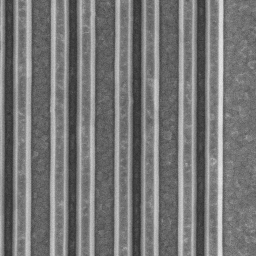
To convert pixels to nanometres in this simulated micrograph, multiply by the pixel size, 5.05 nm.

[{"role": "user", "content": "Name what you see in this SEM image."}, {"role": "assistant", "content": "parallel lines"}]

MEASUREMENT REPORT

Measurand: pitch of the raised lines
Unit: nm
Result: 162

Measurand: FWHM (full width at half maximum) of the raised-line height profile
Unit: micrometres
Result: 0.0758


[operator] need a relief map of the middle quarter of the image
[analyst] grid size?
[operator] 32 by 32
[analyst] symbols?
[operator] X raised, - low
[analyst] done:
X---XXX------XXXX---XXX------XXX
X---XXX------XXXX---XXX------XXX
X---XXX------XXXX---XXX------XXX
X---XXX------XXXX---XXX------XXX
X---XXX------XXXX---XXX------XXX
X---XXX------XXXX---XXX------XXX
X---XXX------XXXX---XXX------XXX
X---XXX------XXXX---XXX------XXX
X---XXX------XXXX---XXX------XXX
X---XXX------XXXX---XXX------XXX
X---XXX------XXXX---XXX------XXX
----XXX------XXXX---XXX------XXX
X---XXX------XXXX---XXX------XXX
X---XXX------XXXX---XXX------XXX
X---XXX------XXXX---XXX------XXX
X---XXX------XXXX---XXX------XXX
X---XXX------XXXX---XXX------XXX
X---XXX------XXXX---XXX------XXX
X---XXX------XXXX---XXX------XXX
X---XXX------XXXX---XXX------XXX
X---XXX------XXXX---XXX------XXX
X---XXX------XXXX---XXX------XXX
X---XXX------XXXX---XXX------XXX
X---XXX------XXXX---XXX------XXX
X---XXX------XXXX---XXX------XXX
X---XXX------XXXX---XXX------XXX
X---XXX------XXXX---XXX------XXX
X---XXX------XXXX---XXX------XXX
X---XXX------XXXX---XXX------XXX
X---XXX------XXXX---XXX------XXX
----XXX------XXXX---XXX------XXX
----XXX------XXXX---XXX------XXX